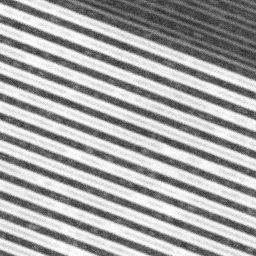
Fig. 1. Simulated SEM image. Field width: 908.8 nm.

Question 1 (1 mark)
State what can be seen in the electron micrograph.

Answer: parallel lines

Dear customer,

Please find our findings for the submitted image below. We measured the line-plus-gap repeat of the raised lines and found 65 nanometers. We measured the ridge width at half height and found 28.2 nm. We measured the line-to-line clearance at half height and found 37.4 nanometers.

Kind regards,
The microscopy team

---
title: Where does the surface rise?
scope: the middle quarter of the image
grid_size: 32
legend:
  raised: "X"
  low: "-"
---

------XXXXX--------XXXXX--------
X--------XXXXX-------XXXXXX-----
XXXX-------XXXXXX-------XXXXXX--
-XXXXX--------XXXXX--------XXXXX
---XXXXXX-------XXXXXX-------XXX
------XXXXX--------XXXXX--------
X--------XXXXX--------XXXXX-----
XXXX-------XXXXXX-------XXXXXX--
-XXXXX--------XXXXX--------XXXXX
----XXXXX--------XXXXX-------XXX
------XXXXXX-------XXXXXX-------
XX-------XXXXX--------XXXXX-----
XXXXX-------XXXXX-------XXXXXX--
--XXXXX--------XXXXX-------XXXXX
----XXXXXX-------XXXXX--------XX
-------XXXXX-------XXXXXX-------
XX--------XXXXX--------XXXX-----
XXXXX-------XXXXXX-------XXXXX--
--XXXXX--------XXXXX-------XXXXX
----XXXXXX-------XXXXXX-------XX
-------XXXXXX-------XXXXXX------
XX--------XXXXX--------XXXXX----
XXXXX-------XXXXXX-------XXXXXX-
---XXXX--------XXXXX--------XXXX
-----XXXXX--------XXXXX--------X
--------XXXXX-------XXXXXX------
XX--------XXXXX--------XXXXX----
XXXXX--------XXXXX-------XXXXXX-
---XXXXX-------XXXXXX-------XXXX
-----XXXXXX-------XXXXX--------X
X-------XXXXX-------XXXXXX------
XXX--------XXXXX--------XXXX----